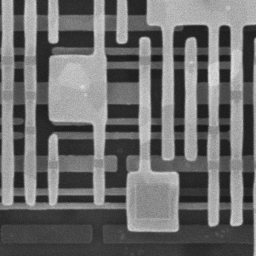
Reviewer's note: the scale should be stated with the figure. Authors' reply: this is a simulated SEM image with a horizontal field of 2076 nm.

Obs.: wiring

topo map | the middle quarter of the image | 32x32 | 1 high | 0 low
11111111111000000001110001100011
11111111111000000001110001100011
11111111111000000001110001100011
11111111111000000001110001100011
11111111111000000001110001100011
11111111111000000001110001100011
11111111111000000001110001100011
11111111111000000001110001100011
11111111111000000001110001100011
11111111111000000001110001100011
11111111111000000001110001100011
11111111111000000001110001100011
11111111111000000001110001100011
11111111111000000001110001100011
00011111111000000001110001100011
00000001110000000001110001100011
00000001110000000001110001100011
00000000110000000001110001100011
00000000110000000001110001110011
00000000110000000001110001110011
00000000110000000001110001110011
00000000110000000001100001110011
00000000110000000001100001110011
00000000110000000001110001100001
00000000110000000001110000000000
00000000110000000001110000000000
00000001110000000001110000000000
00000001110000001111111111110000
00000001110000001111111111111000
00000001110000001111111111111000
00000001110000001111111111111000
00000000110000001111111111111000